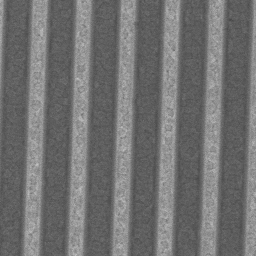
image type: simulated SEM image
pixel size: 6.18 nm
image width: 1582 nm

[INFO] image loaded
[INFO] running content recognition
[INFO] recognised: parallel lines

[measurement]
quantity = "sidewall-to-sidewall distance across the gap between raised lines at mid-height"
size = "164 nanometers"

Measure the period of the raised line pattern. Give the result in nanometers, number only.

273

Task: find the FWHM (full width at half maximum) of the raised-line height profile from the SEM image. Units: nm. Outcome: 110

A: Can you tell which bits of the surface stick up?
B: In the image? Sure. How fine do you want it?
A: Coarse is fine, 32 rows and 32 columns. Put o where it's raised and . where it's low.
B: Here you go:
....oo...oo....oo....oo...oo....
....oo...oo....oo....oo...oo....
....oo...oo....oo...ooo...oo...o
....oo...oo....oo...oo....oo...o
....oo...oo....oo...oo....oo...o
....oo...oo....oo...oo....oo...o
....oo...oo....oo...oo....oo...o
....oo...oo....oo...oo....oo...o
....oo...oo....oo...oo....oo...o
....oo...oo....oo...oo....oo...o
....oo...oo....oo...oo....oo...o
....oo...oo....oo...oo....oo...o
...ooo...oo....oo...oo....oo...o
...ooo...oo....oo...oo....oo...o
...ooo...oo....oo...oo....oo...o
...ooo...oo...ooo...oo...ooo...o
...ooo...oo...ooo...oo...ooo...o
...oo....oo...ooo...oo...ooo...o
...oo....oo...ooo...oo...ooo...o
...oo....oo...ooo...oo...oo....o
...oo....oo...oo....oo...oo....o
...oo....oo...oo....oo...oo....o
...oo....oo...oo....oo...oo....o
...oo....oo...oo....oo...oo....o
...oo....oo...oo....oo...oo....o
...oo....oo...oo....oo...oo....o
...oo....oo...oo....oo...oo....o
...oo....oo...oo....oo...oo....o
...oo...ooo...oo....oo...oo....o
...oo...oo....oo....oo...oo....o
...oo...oo....oo....oo...oo....o
...oo...oo....oo....oo...oo...oo